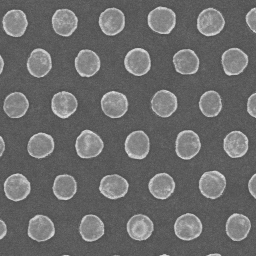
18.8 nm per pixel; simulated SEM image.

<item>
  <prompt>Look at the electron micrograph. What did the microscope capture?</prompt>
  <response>a regular array of raised bodies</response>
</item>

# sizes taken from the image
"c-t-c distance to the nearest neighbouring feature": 885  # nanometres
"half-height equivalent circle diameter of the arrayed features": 479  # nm